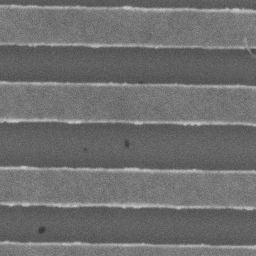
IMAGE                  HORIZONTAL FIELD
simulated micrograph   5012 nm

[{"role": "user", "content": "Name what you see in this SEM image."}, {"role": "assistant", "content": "lines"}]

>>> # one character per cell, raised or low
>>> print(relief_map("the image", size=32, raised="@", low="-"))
--------------------------------
@@@@@@@@@@@@@@@@@@@@@@@@@@@@@@@@
@@@@@@@@@@@@@@@@@@@@@@@@@@@@@@@@
@@@@@@@@@@@@@@@@@@@@@@@@@@@@@@@@
@@@@@@@@@@@@@@@@@@@@@@@@@@@@@@@@
--@@@@@@@@@@@@@@@@@@@@@@@@@@@@@@
--------------------------------
--------------------------------
--------------------------------
--------------------------------
@@@@@@@@@@@@@@@-----------------
@@@@@@@@@@@@@@@@@@@@@@@@@@@@@@@@
@@@@@@@@@@@@@@@@@@@@@@@@@@@@@@@@
@@@@@@@@@@@@@@@@@@@@@@@@@@@@@@@@
@@@@@@@@@@@@@@@@@@@@@@@@@@@@@@@@
-------------------------------@
--------------------------------
--------------------------------
--------------------------------
--------------------------------
--------------------------------
@@@@@@@@@@@@@@@@@@@@@@@@@@@@@@@@
@@@@@@@@@@@@@@@@@@@@@@@@@@@@@@@@
@@@@@@@@@@@@@@@@@@@@@@@@@@@@@@@@
@@@@@@@@@@@@@@@@@@@@@@@@@@@@@@@@
@@@@@@@@@@@@@@@@@@@@@@@@@@@@@@@@
--------------------------------
--------------------------------
--------------------------------
--------------------------------
@@@@@@@@@@@---------------------
@@@@@@@@@@@@@@@@@@@@@@@@@@@@@@@@